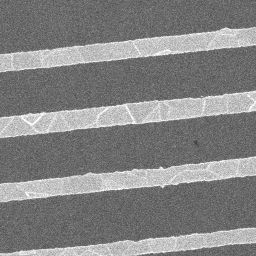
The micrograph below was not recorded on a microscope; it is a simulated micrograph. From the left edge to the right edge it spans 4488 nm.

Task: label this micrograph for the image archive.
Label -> one or a few lines or trenches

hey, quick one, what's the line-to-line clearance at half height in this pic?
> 0.822 µm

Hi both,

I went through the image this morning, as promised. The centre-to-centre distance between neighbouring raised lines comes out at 1150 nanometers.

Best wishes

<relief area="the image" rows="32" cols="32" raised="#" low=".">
................................
................................
................................
................................
......................##########
.............###################
....###################.........
##############..................
####............................
................................
................................
...............................#
......................##########
............#...################
.....#######....#########.......
############....................
######..........................
................................
................................
................................
.........................#######
...............#################
.....######################.....
################................
######..........................
................................
................................
................................
................................
.......................#########
..............###############...
...#################............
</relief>